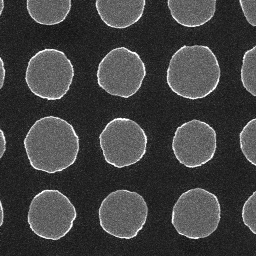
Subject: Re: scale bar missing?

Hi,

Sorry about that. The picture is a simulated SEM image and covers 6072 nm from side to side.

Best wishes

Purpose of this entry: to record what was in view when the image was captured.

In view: a regular array of raised bodies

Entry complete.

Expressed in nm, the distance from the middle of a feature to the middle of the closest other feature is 1670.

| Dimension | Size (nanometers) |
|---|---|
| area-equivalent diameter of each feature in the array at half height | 1140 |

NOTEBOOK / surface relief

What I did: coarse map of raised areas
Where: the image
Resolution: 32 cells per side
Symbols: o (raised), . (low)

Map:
...oooooo...oooooo...oooooo...oo
....ooooo...oooooo...oooooo...oo
....oooo.....oooo.....oooo.....o
................................
................................
................................
.....ooo......ooo.....oooo.....o
....ooooo....ooooo...oooooo...oo
...oooooo...oooooo...oooooo...oo
...oooooo...oooooo...oooooo...oo
...oooooo...oooooo...oooooo...oo
....oooo.....oooo.....oooo.....o
................................
................................
................................
....ooooo.....ooo......ooo.....o
....ooooo....ooooo....ooooo...oo
o..ooooooo..oooooo....ooooo...oo
o..ooooooo...ooooo....ooooo...oo
...ooooooo...ooooo....ooooo....o
....ooooo.....oo.......oo.......
......o.........................
................................
................................
.....ooo......oooo.....oooo....o
....ooooo....ooooo....ooooo....o
....ooooo...oooooo....ooooo...oo
....ooooo...oooooo....ooooo...oo
....ooooo....ooooo....ooooo....o
.....ooo......ooo......ooo......
................................
................................